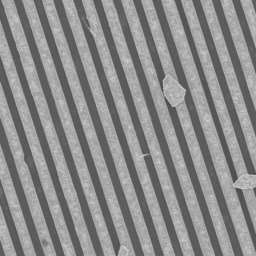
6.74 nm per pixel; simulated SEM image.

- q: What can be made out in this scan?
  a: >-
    parallel lines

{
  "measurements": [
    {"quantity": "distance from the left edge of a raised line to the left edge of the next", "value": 128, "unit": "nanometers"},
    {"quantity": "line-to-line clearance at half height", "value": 0.0538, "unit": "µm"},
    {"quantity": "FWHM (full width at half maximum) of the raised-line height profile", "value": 71.4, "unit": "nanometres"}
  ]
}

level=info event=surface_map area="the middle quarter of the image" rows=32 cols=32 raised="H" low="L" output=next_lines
HHHLLHHHLLHHLLLHHLLHHHLLLHHLLHHH
HHHLLHHHLLHHHLLHHHLLHHHLLHHHLLHH
HHHLLHHHLLHHHLLHHHLLHHHLLHHHLLHH
LHHLLLHHHLLHHLLLHHLLLHHLLHHHLLLH
LHHHLLHHHLLHHHLLHHHLLHHHLHHHHLLH
LHHHLLHHHLLHHHLLHHHLLHHHLHHHHLLH
LLHHLLLHHHLLHHLLLHHLLLHHLHHHHHLL
LLHHHLLHHHLLHHHLLHHHLLHHHHHHHHLL
LLHHHLLHHHLLHHHLLHHHLLHHHLHHHHLL
HLLHHLLLHHHLLHHLLHHHLLHHHLHHHHLL
HLLHHHLLHHHLLHHHLLHHHLLHHHLHHHHL
HLLHHHLLHHHLLHHHLLHHHLLHHHLLHHHL
HHLLHHLLLHHLLLHHLLHHHLLHHHLLHHHL
HHLLHHHLLHHHLLHHHLLHHHLLHHHLLHHH
HHLLHHHLLHHHLLHHHLLHHHLLHHHLLHHH
HHLLLHHLLLHHLLLHHLLHHHLLHHHLLHHH
HHHLLHHHLLHHHLLHHHLLHHHLLHHHLLHH
HHHLLHHHLLHHHLLHHHLLHHHLLHHHLLHH
LHHLLLHHLLLHHLLLHHLLHHHLLHHHLLHH
LHHHLLHHHLLHHHLLHHHLLHHLLLHHHLLH
LHHHLLHHHLLHHHLLHHHLLHHHLLHHHLLH
LLHHLLLHHLLLHHLLHHHLLHHHLLHHHLLH
LLHHHLLHHHLLHHHLLHHHLLHHLLLHHHLL
LLHHHLLHHHLLHHHLLHHHLLHHHLLHHHLL
LLLHHLLHHHLLLHHLLHHHLLHHHLLHHHLL
HLLHHHLLHHHLLHHHLLHHHLLHHLLLHHHL
HLLHHHLLHHHLLHHHLLHHHLLHHHLLHHHL
HLLLHHLLHHHLLLHHLLHHHLLHHHLLHHHL
HHLLHHHLLHHHLLHHHLLHHHLLHHLLLHHL
HHLLHHHLLHHHLLHHHLLHHHLLHHHLLHHH
HHLLLHHLLHHHLLLHHLLHHHLLHHHLLHHH
HHHLLHHHLLHHHLLHHHLLHHLLLHHLLLHH